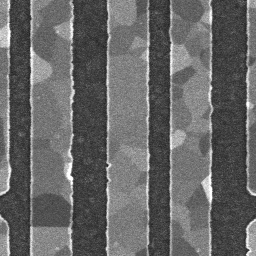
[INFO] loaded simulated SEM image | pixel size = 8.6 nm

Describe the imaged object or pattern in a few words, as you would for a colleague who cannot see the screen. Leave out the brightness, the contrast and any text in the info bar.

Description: one or a few lines or trenches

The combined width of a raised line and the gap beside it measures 0.6 micrometres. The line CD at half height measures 345 nm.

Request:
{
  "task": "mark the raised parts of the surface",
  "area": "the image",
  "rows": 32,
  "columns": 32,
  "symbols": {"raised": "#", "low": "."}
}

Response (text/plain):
#...#####.....#####..#####.....#
#...#####.....#####..#####.....#
#...#####.....#####..#####.....#
#...#####.....####...#####.....#
#...#####.....####...#####.....#
#...#####....#####...#####.....#
#...#####....#####...#####.....#
#...#####....#####...#####.....#
#...#####....#####...#####.....#
#...#####....#####...#####.....#
#...#####....#####...#####.....#
#...#####....#####...#####.....#
#...#####.....####...#####.....#
#...#####....######..#####.....#
#...#####.....####...#####.....#
#...#####.....####...#####.....#
#...#####....#####...#####.....#
#...#####....#####...#####.....#
#...#####....#####...#####.....#
#...#####....######..#####.....#
#...#####....#####...#####.....#
#...#####....#####...#####.....#
#...#####.....####...#####.....#
#...#####....#####...#####.....#
....#####....#####...#####......
....#####....#####...#####......
....#####....#####...#####......
....#####....######..#####......
#...#####....#####...#####.....#
#...#####....#####...#####.....#
#...#####....#####...#####.....#
#...#####....#####...#####.....#